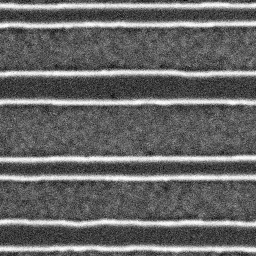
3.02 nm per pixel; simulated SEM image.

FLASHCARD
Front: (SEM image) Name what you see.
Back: lines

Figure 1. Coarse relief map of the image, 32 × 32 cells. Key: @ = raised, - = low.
--------------------------------
@@@@@@@@@@@@@@@@@@@@@@@@@@@@@@@@
@@@@@@@@@@@@@@@@@@@@@@@@@@@@@@@@
--------------------------------
--------------------------------
--------------------------------
--------------------------------
--------------------------------
--------------------------------
@@@@@@@@@@@@@@@@@@@@@@@@@@@@@@@@
@@@@@@@@@@@@@@@@@@@@@@@@@@@@@@@@
@@@@@@@@@@@@@@@@@@@@@@@@@@@@@@@@
@@@@@@@@@@@@@@@@@@@@@@@@@@@@@@@@
--------------------------------
--------------------------------
--------------------------------
--------------------------------
--------------------------------
--------------------------------
--------------------------------
@@@@@@@@@@@@@@@@@@@@@@@@@@@@@@@@
@@@@@@@@@@@@@@@@@@@@@@@@@@@@@@@@
--------------------------------
--------------------------------
--------------------------------
--------------------------------
--------------------------------
--------------------------------
@@@@@@@@@@@@@@@@@@@@@@@@@@@@@@@@
@@@@@@@@@@@@@@@@@@@@@@@@@@@@@@@@
@@@@@@@@@@@@@@@@@@@@@@@@@@@@@@@@
--------------------------------